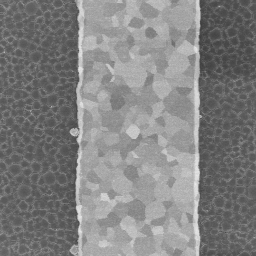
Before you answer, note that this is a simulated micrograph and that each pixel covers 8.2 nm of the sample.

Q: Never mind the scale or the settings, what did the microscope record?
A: one or a few lines or trenches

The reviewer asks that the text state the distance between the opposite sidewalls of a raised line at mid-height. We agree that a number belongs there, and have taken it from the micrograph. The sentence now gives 117 px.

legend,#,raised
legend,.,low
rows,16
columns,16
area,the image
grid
.....#######....
.....#######....
.....#######....
.....#######....
.....#######....
.....#######....
.....#######....
.....#######....
.....#######....
.....#######....
.....#######....
.....#######....
.....#######....
.....#######....
.....#######....
.....#######....